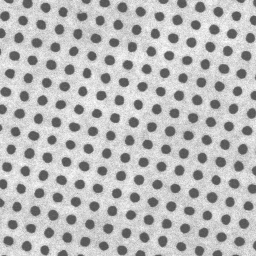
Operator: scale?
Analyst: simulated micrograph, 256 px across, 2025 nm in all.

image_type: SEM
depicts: a regular array of holes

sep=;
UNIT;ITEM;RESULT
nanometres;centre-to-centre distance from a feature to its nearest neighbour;142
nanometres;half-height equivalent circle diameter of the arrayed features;77.9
